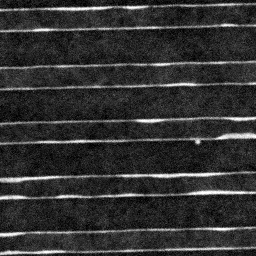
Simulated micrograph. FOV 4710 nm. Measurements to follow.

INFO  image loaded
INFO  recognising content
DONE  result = groups of lines, slits or small figures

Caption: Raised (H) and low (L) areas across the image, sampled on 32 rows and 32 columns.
LLLLLLLLLLLLLLLLLLLLLLLLLLLLLLLH
HHHHHHHHHHHHHHHHHHHHHHHHHHHHHHHH
HHHHHHHHHHHHHHHHHHHHHHHHHHHHHHHH
HHHHHHHHHHHHHHHHHHLLLLLLLLLLLLLL
LLLLLLLLLLLLLLLLLLLLLLLLLLLLLLLL
LLLLLLLLLLLLLLLLLLLLLLLLLLLLLLLL
LLLLLLLLLLLLLLLLLLLLLLLLLLLLLLLL
LLLLLLLLLLLLLLLLLLLLLLLLLLLLLLLL
HHHHHHHHHHHHHHHHHHHHHHHHHHHHHHHH
HHHHHHHHHHHHHHHHHHHHHHHHHHHHHHHH
HHHHHHHHHHHHHHHHHHHHHHHHHHHLLLLL
LLLLLLLLLLLLLLLLLLLLLLLLLLLLLLLL
LLLLLLLLLLLLLLLLLLLLLLLLLLLLLLLL
LLLLLLLLLLLLLLLLLLLLLLLLLLLLLLLL
LLLLLLLLLLLLLLLLLLLLLLLLLLLLLLLL
HHHHHHHHHHHHHHHHHHHHHHHHHHHHHHHH
HHHHHHHHHHHHHHHHHHHHHHHHHHHHHHHH
HHHHHHHHHHHHHHHHHLLLLLLLLLLLLLLL
LLLLLLLLLLLLLLLLLLLLLLLLLLLLLLLL
LLLLLLLLLLLLLLLLLLLLLLLLLLLLLLLL
LLLLLLLLLLLLLLLLLLLLLLLLLLLLLLLL
LLLLLLLLLLLLLLLLLLLLLLLLLLLLLLLL
LLHHHHHHHHHHHHHHHHHHHHHHHHHHHHHH
HHHHHHHHHHHHHHHHHHHHHHHHHHHHHHHH
HHHHHHHHHHHHHHHLLLLLLLLLLLLLLLLL
LLLLLLLLLLLLLLLLLLLLLLLLLLLLLLLL
LLLLLLLLLLLLLLLLLLLLLLLLLLLLLLLL
LLLLLLLLLLLLLLLLLLLLLLLLLLLLLLLL
LLLLLLLLLLLLLLLLLLLLLLLLLLLLLLLL
HHHHHHHHHHHHHHHHHHHHHHHHHHHHHHHH
HHHHHHHHHHHHHHHHHHHHHHHHHHHHHHHH
HHHHHHLLLHHHLLLLLLLLLLLLLLLLLLLL